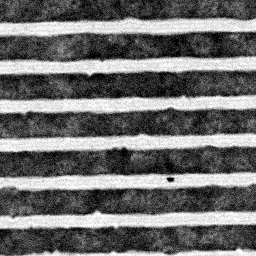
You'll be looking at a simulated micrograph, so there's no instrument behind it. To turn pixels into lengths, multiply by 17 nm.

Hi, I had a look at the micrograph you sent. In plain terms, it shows parallel lines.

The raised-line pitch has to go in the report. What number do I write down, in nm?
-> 659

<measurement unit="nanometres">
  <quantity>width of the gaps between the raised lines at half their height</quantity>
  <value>466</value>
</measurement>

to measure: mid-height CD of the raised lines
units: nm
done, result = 183